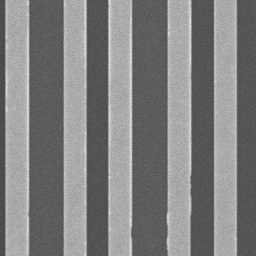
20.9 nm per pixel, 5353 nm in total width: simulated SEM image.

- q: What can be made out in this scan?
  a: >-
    lines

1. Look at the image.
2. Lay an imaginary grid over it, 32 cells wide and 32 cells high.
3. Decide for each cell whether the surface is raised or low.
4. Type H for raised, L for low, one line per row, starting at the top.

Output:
LHHHLLLLHHHLLLHHLLLLLHHHLLLHHHLL
LHHHLLLLHHHLLLHHLLLLLHHHLLLHHHLL
LHHHLLLLHHHLLLHHLLLLLHHHLLLHHHLL
LHHHLLLLHHHLLLHHLLLLLHHHLLLHHHLL
LHHHLLLLHHHLLLHHLLLLLHHHLLLHHHLL
LHHHLLLLHHHLLLHHLLLLLHHHLLLHHHLL
LHHHLLLLHHHLLLHHLLLLLHHHLLLHHHLL
LHHHLLLLHHHLLLHHLLLLLHHHLLLHHHLL
LHHHLLLLHHHLLLHHLLLLLHHHLLLHHHLL
LHHHLLLLHHHLLLHHLLLLLHHHLLLHHHLL
LHHHLLLLHHHLLLHHLLLLLHHHLLLHHHLL
LHHHLLLLHHHLLLHHLLLLLHHHLLLHHHLL
LHHHLLLLHHHLLLHHLLLLLHHHLLLHHHLL
LHHHLLLLHHHLLLHHLLLLLHHHLLLHHHLL
LHHHLLLLHHHLLLHHLLLLLHHHLLLHHHLL
LHHHLLLLHHHLLLHHLLLLLHHHLLLHHHLL
LHHHLLLLHHHLLLHHLLLLLHHHLLLHHHLL
LHHHLLLLHHHLLLHHLLLLLHHHLLLHHHLL
LHHHLLLLHHHLLLHHLLLLLHHHLLLHHHLL
LHHHLLLLHHHLLLHHLLLLLHHHLLLHHHLL
LHHHLLLLHHHLLLHHLLLLLHHHLLLHHHLL
LHHHLLLLHHHLLLHHLLLLLHHHLLLHHHLL
LHHHLLLLHHHLLLHHLLLLLHHHLLLHHHLL
LHHHLLLLHHHLLLHHLLLLLHHHLLLHHHLL
LHHHLLLLHHHLLLHHLLLLLHHHLLLHHHLL
LHHHLLLLHHHLLLHHLLLLLHHHLLLHHHLL
LHHHLLLLHHHLLLHHLLLLLHHHLLLHHHLL
LHHHLLLLHHHLLLHHLLLLLHHHLLLHHHLL
LHHHLLLLHHHLLLHHLLLLLHHHLLLHHHLL
LHHHLLLLHHHLLLHHLLLLLHHHLLLHHHLL
LHHLLLLLHHHLLLHHLLLLLHHHLLLHHHLL
LHHLLLLLHHHLLLHHLLLLLHHHLLLHHHLL